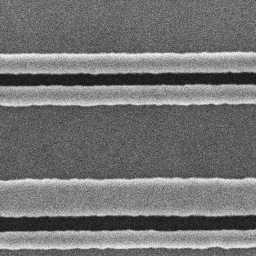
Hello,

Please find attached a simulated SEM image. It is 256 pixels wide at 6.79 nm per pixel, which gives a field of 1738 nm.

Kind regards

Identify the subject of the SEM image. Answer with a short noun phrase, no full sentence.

lines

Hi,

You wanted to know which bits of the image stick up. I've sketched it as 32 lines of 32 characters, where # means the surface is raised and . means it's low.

................................
................................
................................
................................
................................
................................
................................
################################
################################
................................
................................
################################
################################
................................
................................
................................
................................
................................
................................
................................
................................
................................
...#..#..#....##.###########..##
################################
################################
################################
################################
................................
................................
################################
################################
................................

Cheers